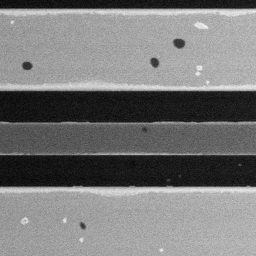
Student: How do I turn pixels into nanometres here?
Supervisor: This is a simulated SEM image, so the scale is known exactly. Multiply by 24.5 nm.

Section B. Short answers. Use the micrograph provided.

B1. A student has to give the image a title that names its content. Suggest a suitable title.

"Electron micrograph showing lines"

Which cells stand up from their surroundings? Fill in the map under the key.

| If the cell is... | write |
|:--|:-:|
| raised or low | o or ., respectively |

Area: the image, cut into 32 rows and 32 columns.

................................
oooooooooooooooooooooooooooooooo
oooooooooooooooooooooooooooooooo
oooooooooooooooooooooooooooooooo
oooooooooooooooooooooooooooooooo
oooooooooooooooooooooooooooooooo
oooooooooooooooooooooooooooooooo
oooooooooooooooooooooooooooooooo
oooooooooooooooooooooooooooooooo
oooooooooooooooooooooooooooooooo
oooooooooooooooooooooooooooooooo
................................
................................
................................
................................
oooooooooooooooooooooooooooooooo
oooooooooooooooooooooooooooooooo
oooooooooooooooooooooooooooooooo
oooooooooooooooooooooooooooooooo
................................
................................
................................
................................
o.....ooooo.............ooo.oooo
oooooooooooooooooooooooooooooooo
oooooooooooooooooooooooooooooooo
oooooooooooooooooooooooooooooooo
oooooooooooooooooooooooooooooooo
oooooooooooooooooooooooooooooooo
oooooooooooooooooooooooooooooooo
oooooooooooooooooooooooooooooooo
oooooooooooooooooooooooooooooooo